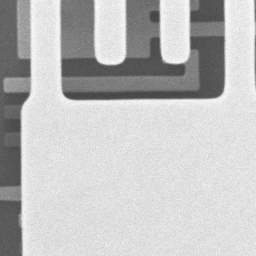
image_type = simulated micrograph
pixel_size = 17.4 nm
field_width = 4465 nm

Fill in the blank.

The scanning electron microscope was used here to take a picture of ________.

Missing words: wiring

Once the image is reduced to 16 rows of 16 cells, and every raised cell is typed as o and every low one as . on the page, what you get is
..oo..oo..oo..oo
..oo..oo..oo..oo
..oo..oo..oo..oo
..oo..oo..oo..oo
..oo..........oo
..oo..........oo
..oooooooooooooo
.ooooooooooooooo
.ooooooooooooooo
.ooooooooooooooo
.ooooooooooooooo
.ooooooooooooooo
.ooooooooooooooo
.ooooooooooooooo
.ooooooooooooooo
.ooooooooooooooo